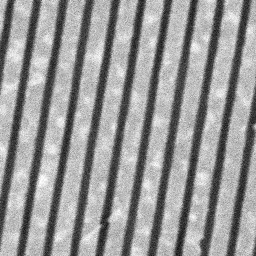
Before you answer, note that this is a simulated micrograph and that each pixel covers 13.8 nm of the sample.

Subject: parallel lines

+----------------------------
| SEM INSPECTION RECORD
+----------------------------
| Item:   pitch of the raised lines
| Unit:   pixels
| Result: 25.8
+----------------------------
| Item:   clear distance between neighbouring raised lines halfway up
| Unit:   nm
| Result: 129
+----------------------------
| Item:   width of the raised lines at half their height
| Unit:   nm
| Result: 231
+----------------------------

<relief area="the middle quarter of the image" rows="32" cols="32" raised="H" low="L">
HHLLLHHHHLLHHHHHLLHHHHLLHHHHHLLH
HHLLLHHHHLLHHHHLLLHHHHLLHHHHLLLH
HHLLLHHHHLLHHHHLLLHHHHLLHHHHLLLH
HHLLHHHHLLLHHHHLLLHHHHLLHHHHLLLH
HHLLHHHHLLLHHHHLLHHHHLLLHHHHLLLH
HHLLHHHHLLLHHHHLLHHHHLLLHHHHLLHH
HLLLHHHHLLHHHHHLLHHHHLLHHHHHLLHH
HLLLHHHHLLHHHHLLLHHHHLLHHHHLLLHH
HLLLHHHHLLHHHHLLLHHHHLLHHHHLLLHH
HLLHHHHHLLHHHHLLLHHHHLLHHHHLLLHH
HLLHHHHLLLHHHHLLHHHHLLLHHHHLLLHH
HLLHHHHLLLHHHHLLHHHHLLLHHHHLLHHH
HLLHHHHLLHHHHHLLHHHHLLLHHHHLLHHH
HLLHHHHLLHHHHLLLHHHHLLHHHHLLLHHH
LLLHHHHLLHHHHLLLHHHHLLHHHHLLLHHH
LLHHHHLLLHHHHLLHHHHHLLHHHHLLLHHH
LLHHHHLLLHHHHLLHHHHLLLHHHHLLLHHH
LLHHHHLLLHHHHLLHHHHLLLHHHHLLHHHH
LLHHHHLLHHHHHLLHHHHLLLHHHHLLHHHH
LLHHHHLLHHHHLLLHHHHLLHHHHLLLHHHH
LLHHHHLLHHHHLLLHHHHLLHHHHLLLHHHH
LHHHHLLLHHHHLLHHHHHLLHHHHLLLHHHH
LHHHHLLLHHHHLLHHHHLLLHHHHLLLHHHL
LHHHHLLLHHHHLLHHHHLLLHHHHLLHHHHL
LHHHHLLHHHHLLLHHHHLLLHHHHLLHHHHL
LHHHHLLHHHHLLLHHHHLLHHHHHLLHHHHL
LHHHHLLHHHHLLLHHHHLLHHHHLLLHHHHL
HHHHLLLHHHHLLHHHHHLLHHHHLLLHHHHL
HHHHLLLHHHHLLHHHHLLLHHHHLLHHHHLL
HHHHLLLHHHHLLHHHHLLLHHHHLLHHHHLL
HHHHLLHHHHLLLHHHHLLLHHHHLLHHHHLL
HHHHLLHHHHLLLHHHHLLHHHHLLLHHHHLL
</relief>